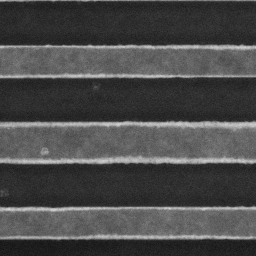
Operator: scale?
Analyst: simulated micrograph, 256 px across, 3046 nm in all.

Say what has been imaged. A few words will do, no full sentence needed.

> lines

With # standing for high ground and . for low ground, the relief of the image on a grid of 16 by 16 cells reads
................
................
................
################
################
................
................
................
################
################
................
................
................
################
################
................